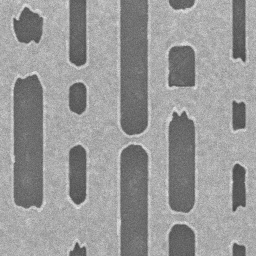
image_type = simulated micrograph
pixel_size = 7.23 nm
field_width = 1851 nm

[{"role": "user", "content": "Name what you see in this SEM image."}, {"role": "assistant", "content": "parallel lines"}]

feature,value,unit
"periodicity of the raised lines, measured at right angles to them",384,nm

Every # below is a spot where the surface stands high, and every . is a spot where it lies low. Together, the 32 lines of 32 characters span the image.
#########..####....##...#####..#
###.#####..####....##########..#
##...####..####....##########..#
##...####..####....##########..#
##...####..####...###########..#
#########..####....##########..#
#########..####....##...#####..#
#########..####....##...######.#
###############....##...########
####.##########....##...########
##...####.#####....##...########
##...####..####....#############
##...####..####....#############
##...####..####....##########..#
##...##########....###..#####..#
##...##########...###...#####..#
##...###########..###....#######
##...################....#######
##...####..#####..###....#######
##...####..####...###....#######
##...####..####....##....#######
##...####..####....##....####..#
##...####..####....##....####..#
##...####..####....##...#####..#
##...####..####....##...#####..#
##...####.#####....##...#####..#
###############....###..########
###############....#############
###############....##...########
###############....##...########
###############....##...#####.##
#########..####....##....####..#